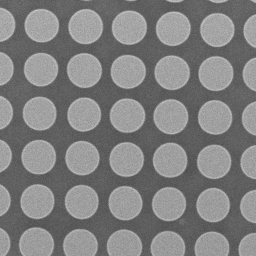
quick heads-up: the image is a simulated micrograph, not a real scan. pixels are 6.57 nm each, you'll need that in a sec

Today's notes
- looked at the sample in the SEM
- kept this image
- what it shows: an array of small figures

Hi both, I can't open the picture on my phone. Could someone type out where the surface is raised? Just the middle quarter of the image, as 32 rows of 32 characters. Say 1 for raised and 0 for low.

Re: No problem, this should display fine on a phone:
01111111100011111111000111111110
01111111100011111111000111111110
01111111100011111111000111111110
01111111100011111111000111111110
00111111000001111110000111111110
00011110000000111100000011111100
00000000000000000000000000000000
00000000000000000000000000000000
00000000000000000000000000000000
00111111000001111100000001111000
00111111100011111110000111111100
01111111100011111111000111111110
01111111100011111111000111111110
01111111100011111111000111111110
01111111100011111111000111111110
00111111000011111110000111111100
00001110000001111100000011111100
00000000000000000000000000000000
00000000000000000000000000000000
00001000000000000000000000000000
00111110000001111100000011111000
01111111000011111110000111111100
01111111100011111111000111111100
11111111100011111111001111111110
01111111100011111111001111111110
01111111000011111110000111111110
01111110000011111110000111111100
00011100000001111100000011111000
00000000000000000000000000000000
00000000000000000000000000000000
00011000000000000000000000000000
01111110000001111100000011111000